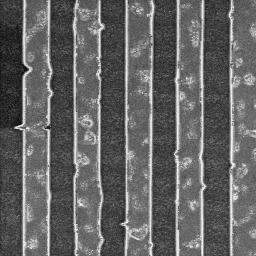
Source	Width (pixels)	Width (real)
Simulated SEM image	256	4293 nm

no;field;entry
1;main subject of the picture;parallel lines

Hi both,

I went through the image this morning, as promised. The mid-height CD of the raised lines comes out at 417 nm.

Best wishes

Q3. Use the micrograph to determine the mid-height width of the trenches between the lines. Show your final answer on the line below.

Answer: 448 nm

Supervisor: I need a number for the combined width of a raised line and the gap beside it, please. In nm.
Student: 857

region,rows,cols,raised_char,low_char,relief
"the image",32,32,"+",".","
...+++....++....+++...+++....+++
...+++...+++....+++...+++....+++
...+++...+++....+++...+++....+++
...+++...++++...+++...+++....+++
...+++...+++....+++...+++....+++
...+++...+++....+++...+++....+++
...+++...+++....+++...+++....+++
...+++...+++....+++...+++....+++
...+++...+++....+++...+++....+++
...+++...+++....+++...+++....+++
...+++...+++....+++...+++....+++
...+++...+++....+++...+++....+++
...+++...+++....+++...+++....+++
...+++...+++....+++...+++....+++
...+++...+++....+++...+++....+++
...+++...+++....+++...+++....+++
...+++...+++....+++...+++....+++
...+++...+++....+++...+++....+++
...+++...+++....+++...+++....+++
...+++...+++....+++...+++....+++
...+++....++....+++...+++....+++
...+++....++....+++...+++....+++
...+++...+++....+++...+++....+++
...+++...++++...+++...+++....+++
...+++...++++...+++...+++....+++
...+++...++++...+++...+++....+++
...+++...+++....+++...+++....+++
...+++...+++....+++...+++....+++
...+++...+++....+++...+++....+++
...+++....+++...+++...+++....+++
...+++....+++...+++...+++....+++
...+++....++....+++...+++....+++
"